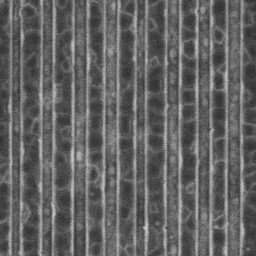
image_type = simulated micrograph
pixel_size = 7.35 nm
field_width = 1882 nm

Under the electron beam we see parallel lines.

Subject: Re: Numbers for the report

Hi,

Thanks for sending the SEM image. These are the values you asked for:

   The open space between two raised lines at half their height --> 87.3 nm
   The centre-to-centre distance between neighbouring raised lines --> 230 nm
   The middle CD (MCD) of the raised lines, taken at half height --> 143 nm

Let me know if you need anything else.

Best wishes